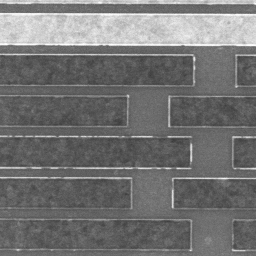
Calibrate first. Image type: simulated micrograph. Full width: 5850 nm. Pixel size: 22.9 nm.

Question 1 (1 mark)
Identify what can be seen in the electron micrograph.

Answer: parallel lines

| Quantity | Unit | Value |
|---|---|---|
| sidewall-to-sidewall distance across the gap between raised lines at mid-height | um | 0.237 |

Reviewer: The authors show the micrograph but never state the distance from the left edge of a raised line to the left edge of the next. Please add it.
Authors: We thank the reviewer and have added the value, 940 nanometers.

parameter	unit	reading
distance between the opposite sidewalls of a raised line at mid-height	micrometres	0.708